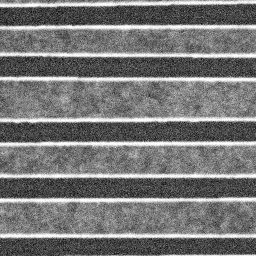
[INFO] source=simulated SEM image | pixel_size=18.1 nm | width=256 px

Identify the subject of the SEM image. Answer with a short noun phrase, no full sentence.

lines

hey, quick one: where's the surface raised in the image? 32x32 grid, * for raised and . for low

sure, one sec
******************..............
................................
................................
...*****************************
********************************
********************************
********************************
................................
................................
................................
********************************
********************************
********************************
********************************
********************************
................................
................................
................................
********************************
********************************
********************************
********************************
................................
................................
................................
********************************
********************************
********************************
********************************
...........*...........*...**.**
................................
................................